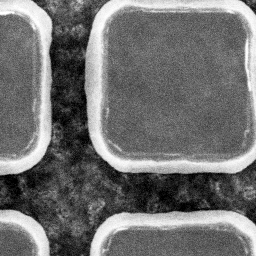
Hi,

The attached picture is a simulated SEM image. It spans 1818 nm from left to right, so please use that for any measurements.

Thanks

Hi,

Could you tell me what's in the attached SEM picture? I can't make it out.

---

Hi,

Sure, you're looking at raised bodies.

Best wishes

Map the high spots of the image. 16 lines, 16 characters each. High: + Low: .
++.....++++++++.
+++...++++++++++
+++...++++++++++
+++...++++++++++
+++...++++++++++
+++...++++++++++
+++...++++++++++
+++...++++++++++
+++...++++++++++
++....++++++++++
.............+..
................
................
+...........+++.
++....++++++++++
+++...++++++++++